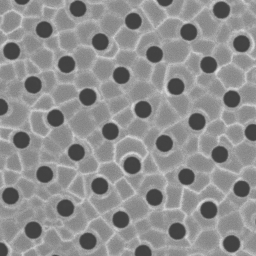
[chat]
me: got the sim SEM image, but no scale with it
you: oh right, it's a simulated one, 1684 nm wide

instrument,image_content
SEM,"a regular array of holes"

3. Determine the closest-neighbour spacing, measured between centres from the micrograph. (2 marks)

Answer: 0.257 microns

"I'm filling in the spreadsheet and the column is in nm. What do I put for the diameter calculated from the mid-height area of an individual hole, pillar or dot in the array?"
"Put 114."